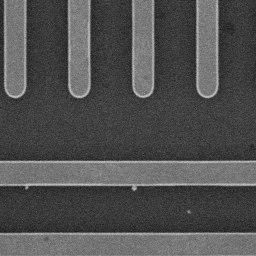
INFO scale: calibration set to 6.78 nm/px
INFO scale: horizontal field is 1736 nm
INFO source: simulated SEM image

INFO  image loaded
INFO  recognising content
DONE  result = groups of lines, slits or small figures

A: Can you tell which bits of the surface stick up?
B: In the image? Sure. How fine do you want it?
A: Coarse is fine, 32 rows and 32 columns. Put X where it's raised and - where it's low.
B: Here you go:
-XX------XX------XX------XX-----
-XX------XX------XX------XX-----
-XX------XX------XX------XX-----
-XX------XX------XX------XX-----
-XX------XX------XX------XX-----
-XX------XX------XX------XX-----
-XX------XX------XX------XX-----
-XX------XX------XX------XX-----
-XX------XX------XX------XX-----
-XX------XX------XX------XX-----
-XX------XX------XX------XX-----
-XX------XX------XX------XX-----
--------------------------------
--------------------------------
--------------------------------
--------------------------------
--------------------------------
--------------------------------
--------------------------------
--------------------------------
XXXXXXXXXXXXXXXXXXXXXXXXXXXXXXXX
XXXXXXXXXXXXXXXXXXXXXXXXXXXXXXXX
XXXXXXXXXXXXXXXXXXXXXXXXXXXXXXXX
--------------------------------
--------------------------------
--------------------------------
--------------------------------
--------------------------------
--------------------------------
XXXXXXXXXXXXXXXXXXXXXXXXXXXXXXXX
XXXXXXXXXXXXXXXXXXXXXXXXXXXXXXXX
XXXXXXXXXXXXXXXXXXXXXXXXXXXXXXXX